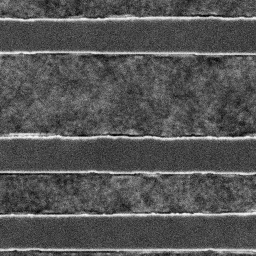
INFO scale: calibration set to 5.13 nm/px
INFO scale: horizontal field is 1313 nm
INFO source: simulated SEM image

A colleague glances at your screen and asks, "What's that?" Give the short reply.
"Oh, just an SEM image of lines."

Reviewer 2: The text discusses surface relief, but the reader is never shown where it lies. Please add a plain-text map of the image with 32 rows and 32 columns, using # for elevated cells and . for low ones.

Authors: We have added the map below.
................................
................................
################################
################################
################################
################################
################################
................................
................................
................................
................................
.............#..................
................................
................................
................................
................................
................................
################################
################################
################################
################################
################################
................................
................................
................................
................................
................................
################################
################################
################################
################################
................................